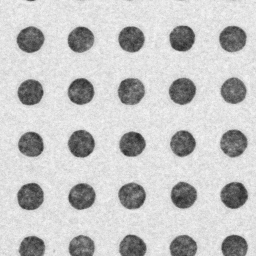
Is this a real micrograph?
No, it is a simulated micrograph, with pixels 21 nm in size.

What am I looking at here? a regular array of holes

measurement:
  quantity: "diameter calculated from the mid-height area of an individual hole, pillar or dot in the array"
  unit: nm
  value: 568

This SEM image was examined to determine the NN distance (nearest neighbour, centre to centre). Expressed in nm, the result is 1060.